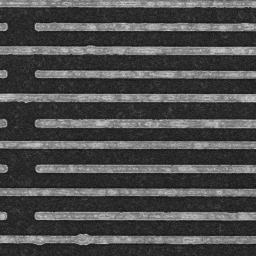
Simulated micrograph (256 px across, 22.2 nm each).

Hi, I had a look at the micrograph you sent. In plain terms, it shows parallel lines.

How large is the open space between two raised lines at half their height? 0.353 micrometres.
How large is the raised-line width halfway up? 164 nm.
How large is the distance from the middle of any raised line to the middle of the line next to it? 525 nm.